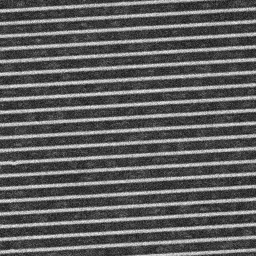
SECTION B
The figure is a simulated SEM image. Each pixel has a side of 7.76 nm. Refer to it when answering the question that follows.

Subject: parallel lines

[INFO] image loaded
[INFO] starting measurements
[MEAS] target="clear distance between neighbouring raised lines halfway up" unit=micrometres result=0.0765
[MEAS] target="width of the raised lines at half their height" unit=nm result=21.3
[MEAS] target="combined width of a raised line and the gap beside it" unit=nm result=98.3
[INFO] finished